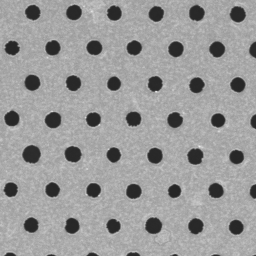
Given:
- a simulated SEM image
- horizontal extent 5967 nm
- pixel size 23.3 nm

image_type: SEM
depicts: a regular array of holes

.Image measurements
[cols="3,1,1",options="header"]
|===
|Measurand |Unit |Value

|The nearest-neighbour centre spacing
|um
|0.94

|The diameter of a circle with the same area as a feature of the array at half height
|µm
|0.359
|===